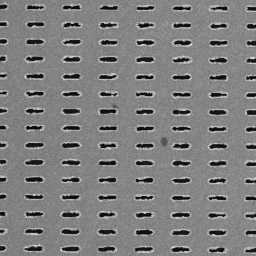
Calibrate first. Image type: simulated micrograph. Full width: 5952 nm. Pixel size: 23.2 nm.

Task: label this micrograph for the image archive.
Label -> a regular array of holes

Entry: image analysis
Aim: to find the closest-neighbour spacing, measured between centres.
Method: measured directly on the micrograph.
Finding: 398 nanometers